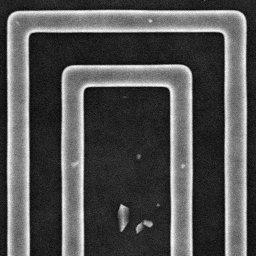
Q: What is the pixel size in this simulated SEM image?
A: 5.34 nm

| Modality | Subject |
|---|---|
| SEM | groups of lines, slits or small figures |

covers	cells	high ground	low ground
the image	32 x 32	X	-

--------------------------------
--XXXXXXXXXXXXXXXXXXXXXXXXXXXX--
-XXXXXXXXXXXXXXXXXXXXXXXXXXXXXX-
-XXXXXXXXXXXXXXXXXXXXXXXXXXXXXX-
-XXX------------------------XXX-
-XXX------------------------XXX-
-XXX------------------------XXX-
-XXX------------------------XXX-
-XXX----XXXXXXXXXXXXXXX-----XXX-
-XXX----XXXXXXXXXXXXXXXX----XXX-
-XXX----XXXXXXXXXXXXXXXX----XXX-
-XXX----XX-----------XXX----XXX-
-XXX----XX-----------XXX----XXX-
-XXX----XX-----------XXX----XXX-
-XXX----XX-----------XXX----XXX-
-XXX----XX-----------XXX----XXX-
-XXX----XX-----------XXX----XXX-
-XXX----XX-----------XXX----XXX-
-XXX----XX-----------XXX----XXX-
-XXX----XX-----------XXX----XXX-
-XXX----XX-----------XXX----XXX-
-XXX----XX-----------XXX----XXX-
-XXX----XX-----------XXX----XXX-
-XXX----XX-----------XXX----XXX-
-XXX----XX-----------XXX----XXX-
-XXX----XX-----------XXX----XXX-
-XXX----XX-----------XXX----XXX-
-XXX----XX-----------XXX----XXX-
-XXX----XX-----------XXX----XXX-
-XXX----XX-----------XXX----XXX-
-XXX----XX-----------XXX----XXX-
-XXX----XX-----------XXX----XXX-